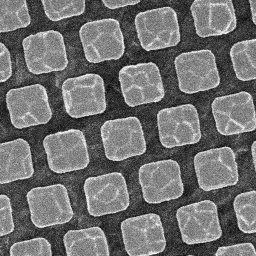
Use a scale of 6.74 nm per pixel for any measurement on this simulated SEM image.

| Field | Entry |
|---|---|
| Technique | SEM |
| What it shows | a regular array of raised bodies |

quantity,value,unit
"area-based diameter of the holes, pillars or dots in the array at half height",298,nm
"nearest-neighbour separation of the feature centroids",56.5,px